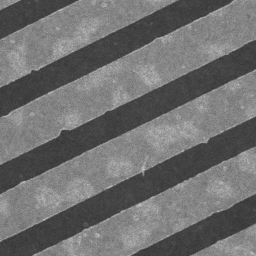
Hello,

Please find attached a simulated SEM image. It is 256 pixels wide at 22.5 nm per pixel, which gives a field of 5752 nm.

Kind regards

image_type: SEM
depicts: one or a few lines or trenches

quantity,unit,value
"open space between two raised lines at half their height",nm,612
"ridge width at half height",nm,948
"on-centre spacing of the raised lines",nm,1550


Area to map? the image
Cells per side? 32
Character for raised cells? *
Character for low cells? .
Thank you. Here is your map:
*........************........***
.......************........*****
.....************........*******
...************........*********
.************........***********
***********........************.
*********........************...
*******........************.....
*****........************.......
***........************.......**
*........************.......****
......*************.......******
....************........********
..************........**********
.***********........************
**********........************..
********........************....
******........************......
****........************........
**........************........**
........************.......*****
......************.......*******
....***********.........********
..***********........***********
************.......************.
**********........***********...
********.......************.....
*****........************.......
***........************........*
*........************........***
.......************........*****
.....************........*******